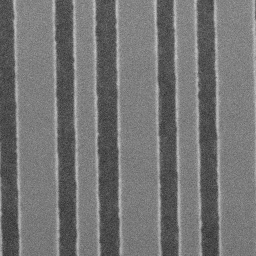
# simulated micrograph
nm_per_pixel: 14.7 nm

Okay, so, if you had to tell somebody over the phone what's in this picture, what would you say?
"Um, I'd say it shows lines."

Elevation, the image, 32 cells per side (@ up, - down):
--@@@@@--@@@---@@@@---@@---@@@@@
--@@@@@--@@@---@@@@---@@@--@@@@@
--@@@@@--@@@---@@@@---@@@--@@@@@
--@@@@@--@@@---@@@@@--@@@--@@@@@
--@@@@@--@@@---@@@@@--@@@--@@@@@
--@@@@@--@@@---@@@@@--@@@--@@@@@
--@@@@@--@@@---@@@@@--@@@--@@@@@
--@@@@@--@@@---@@@@@--@@@--@@@@@
--@@@@@--@@@---@@@@@--@@@--@@@@@
--@@@@@--@@@---@@@@@--@@@--@@@@@
--@@@@@--@@@---@@@@@--@@@--@@@@@
--@@@@@--@@@---@@@@@--@@@--@@@@@
--@@@@@--@@@---@@@@@--@@@--@@@@@
--@@@@@--@@@---@@@@@--@@@--@@@@@
--@@@@@---@@---@@@@@--@@@--@@@@@
--@@@@@--@@@---@@@@@--@@@--@@@@@
--@@@@@---@@---@@@@@--@@@--@@@@@
--@@@@@---@@---@@@@@--@@@--@@@@@
--@@@@@---@@---@@@@@--@@@--@@@@@
--@@@@@---@@---@@@@@--@@@--@@@@@
--@@@@@---@@---@@@@@--@@@--@@@@@
--@@@@@---@@---@@@@@--@@@--@@@@@
--@@@@@---@@---@@@@@--@@@--@@@@@
--@@@@@---@@---@@@@@--@@@--@@@@@
--@@@@@---@@---@@@@@--@@@--@@@@@
--@@@@@---@@---@@@@@--@@@--@@@@@
--@@@@@---@@---@@@@@--@@@--@@@@@
--@@@@@---@@---@@@@@--@@@--@@@@@
--@@@@@---@@---@@@@@--@@@--@@@@@
--@@@@@---@@---@@@@@--@@@--@@@@@
--@@@@@---@@---@@@@@--@@@--@@@@@
--@@@@@---@@---@@@@@--@@@--@@@@@